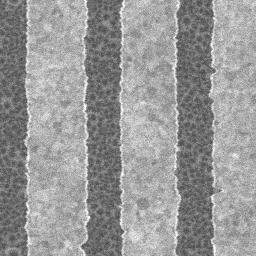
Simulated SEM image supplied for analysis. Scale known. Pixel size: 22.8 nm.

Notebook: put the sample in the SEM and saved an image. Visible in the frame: one or a few lines or trenches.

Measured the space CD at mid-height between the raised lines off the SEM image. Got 812 nanometres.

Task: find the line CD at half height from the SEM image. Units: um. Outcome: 1.29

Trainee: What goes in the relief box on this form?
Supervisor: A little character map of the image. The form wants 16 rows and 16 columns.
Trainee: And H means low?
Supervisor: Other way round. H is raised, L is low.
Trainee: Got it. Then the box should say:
LLHHHLLLHHHLLHHH
LLHHHLLLHHHLLHHH
LLHHHLLLHHHLLHHH
LLHHHLLLHHHLLHHH
LLHHHLLLHHHLLHHH
LLHHHLLLHHHLLHHH
LLHHHLLLHHHLLHHH
LLHHHLLLHHHLLHHH
LLHHHLLHHHHLLHHH
LLHHHLLLHHHLLHHH
LLHHHLLLHHHLLHHH
LLHHHLLLHHHLLHHH
LLHHHLLLHHHLLHHH
LLHHHLLLHHHLLHHH
LLHHHLLLHHHLLHHH
LLHHHLLLHHHLLHHH